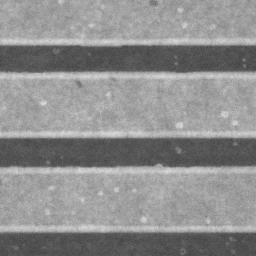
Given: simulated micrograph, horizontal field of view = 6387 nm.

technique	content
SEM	lines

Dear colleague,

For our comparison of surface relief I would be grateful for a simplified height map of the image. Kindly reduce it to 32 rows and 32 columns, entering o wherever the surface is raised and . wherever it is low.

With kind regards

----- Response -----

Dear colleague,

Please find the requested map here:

oooooooooooooooooooooooooooooooo
oooooooooooooooooooooooooooooooo
oooooooooooooooooooooooooooooooo
oooooooooooooooooooooooooooooooo
oooooooooooooooooooooooooooooooo
................................
................................
................................
................................
oooooooooooooooooooooooooooooooo
oooooooooooooooooooooooooooooooo
oooooooooooooooooooooooooooooooo
oooooooooooooooooooooooooooooooo
oooooooooooooooooooooooooooooooo
oooooooooooooooooooooooooooooooo
oooooooooooooooooooooooooooooooo
oooooooooooooooooooooooooooooooo
................................
................................
................................
................................
oooooooooooooooooooooooooooooooo
oooooooooooooooooooooooooooooooo
oooooooooooooooooooooooooooooooo
oooooooooooooooooooooooooooooooo
oooooooooooooooooooooooooooooooo
oooooooooooooooooooooooooooooooo
oooooooooooooooooooooooooooooooo
oooooooooooooooooooooooooooooooo
................................
................................
................................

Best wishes